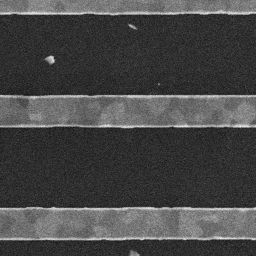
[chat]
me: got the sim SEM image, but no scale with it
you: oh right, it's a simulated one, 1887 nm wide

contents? lines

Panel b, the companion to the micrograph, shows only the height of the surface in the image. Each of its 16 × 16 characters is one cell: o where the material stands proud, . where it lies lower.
oooooooooooooooo
................
................
................
................
................
oooooooooooooooo
oooooooooooooooo
................
................
................
................
................
oooooooooooooooo
oooooooooooooooo
................